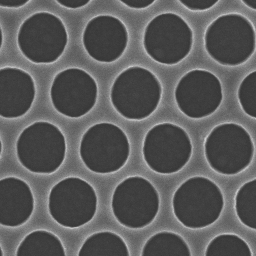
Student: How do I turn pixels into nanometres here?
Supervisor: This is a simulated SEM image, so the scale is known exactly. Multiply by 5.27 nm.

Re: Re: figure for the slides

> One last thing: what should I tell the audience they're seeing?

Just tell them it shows a regular array of holes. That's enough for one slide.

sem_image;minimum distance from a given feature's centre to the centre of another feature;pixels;62.4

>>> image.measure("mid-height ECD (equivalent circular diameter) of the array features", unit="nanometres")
255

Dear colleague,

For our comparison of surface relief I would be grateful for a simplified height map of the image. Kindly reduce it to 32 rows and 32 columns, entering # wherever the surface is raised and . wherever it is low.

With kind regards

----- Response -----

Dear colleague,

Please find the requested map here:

...#####...#####...####....####.
################################
###....#####...####....####....#
###.....###.....##......##.....#
##......##......##......##......
##......###.....##......##......
###.....###....###......##......
####...#####..#####....####....#
#################.##############
....###....####....####....####.
....###.....##......##.....###..
....##......##......##......##..
....###.....##......##......##..
....###....####....####....###..
..#######.######..######..######
####..######.###############.###
###.....###....####....####....#
##......##......##......##.....#
##......##......##......##......
##......##......##......##.....#
###.....###....####....###.....#
####..######.#######..######..##
..######..######..######..######
....###....####....###.....###..
....##......##......##......##..
....##......##......##......#...
....##......##......##......##..
...####....####....###.....###..
################################
####...#####...####...#####..###
###.....##......##.....###.....#
##......##......##......##.....#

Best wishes